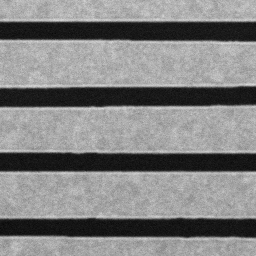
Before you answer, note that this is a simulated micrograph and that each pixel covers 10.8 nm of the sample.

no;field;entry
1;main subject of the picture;lines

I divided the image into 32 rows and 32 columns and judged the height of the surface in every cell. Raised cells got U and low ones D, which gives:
UUUUUUUUUUUUUUUUUUUUUUUUUUUUUUUU
UUUUUUUUUUUUUUUUUUUUUUUUUUUUUUUU
UUUUUUUUUUUUUUUUUUUUUUUUUUUUUUUU
DDDDDDDDDDDDDDDDDDDDDDDDDDDDDDDD
DDDDDDDDDDDDDDDDDDDDDDDDDDDDDDDD
UUUUUUUUUUUUUUUUUUUUUUUUUUUUUUUU
UUUUUUUUUUUUUUUUUUUUUUUUUUUUUUUU
UUUUUUUUUUUUUUUUUUUUUUUUUUUUUUUU
UUUUUUUUUUUUUUUUUUUUUUUUUUUUUUUU
UUUUUUUUUUUUUUUUUUUUUUUUUUUUUUUU
UUUUUUUUUUUUUUUUUUUUUUUUUUUUUUUU
DDDDDDDDDDDDDDDDDDDDDDDDDDDDDDDD
DDDDDDDDDDDDDDDDDDDDDDDDDDDDDDDD
DDDDDUUUUUUUUUUUUUUUUUUUUUUUUUUU
UUUUUUUUUUUUUUUUUUUUUUUUUUUUUUUU
UUUUUUUUUUUUUUUUUUUUUUUUUUUUUUUU
UUUUUUUUUUUUUUUUUUUUUUUUUUUUUUUU
UUUUUUUUUUUUUUUUUUUUUUUUUUUUUUUU
UUUUUUUUUUUUUUUUUUUUUUUUUUUUUUUU
DDDDDDDDDDDDDDDDDDDDDDDDDDDDDDDD
DDDDDDDDDDDDDDDDDDDDDDDDDDDDDDDD
DDDDDDDDDDDDDDDDDDDDDDDDDDDDDDDD
UUUUUUUUUUUUUUUUUUUUUUUUUUUUUUUU
UUUUUUUUUUUUUUUUUUUUUUUUUUUUUUUU
UUUUUUUUUUUUUUUUUUUUUUUUUUUUUUUU
UUUUUUUUUUUUUUUUUUUUUUUUUUUUUUUU
UUUUUUUUUUUUUUUUUUUUUUUUUUUUUUUU
DDDDDDDDDDDDDDDDDDDDDDDDDDDDDDDD
DDDDDDDDDDDDDDDDDDDDDDDDDDDDDDDD
DDDDDDDDDDDDDDDDDDDDDDDDDDDDDDDD
UUUUUUUUUUUUUUUUUUUUUUUUUUUUUUUU
UUUUUUUUUUUUUUUUUUUUUUUUUUUUUUUU